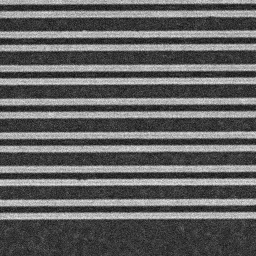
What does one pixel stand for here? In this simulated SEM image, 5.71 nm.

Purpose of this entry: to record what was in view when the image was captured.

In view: parallel lines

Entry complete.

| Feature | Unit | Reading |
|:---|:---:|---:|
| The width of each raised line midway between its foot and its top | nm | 34.3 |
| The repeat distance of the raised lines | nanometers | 95.9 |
